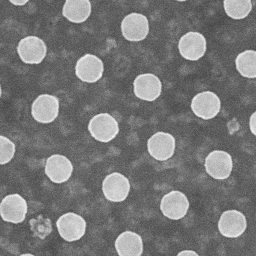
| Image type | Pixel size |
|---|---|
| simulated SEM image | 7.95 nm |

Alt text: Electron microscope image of a regular array of raised bodies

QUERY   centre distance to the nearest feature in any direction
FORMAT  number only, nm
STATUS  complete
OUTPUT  476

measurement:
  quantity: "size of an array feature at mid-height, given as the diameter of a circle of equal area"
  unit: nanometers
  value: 216